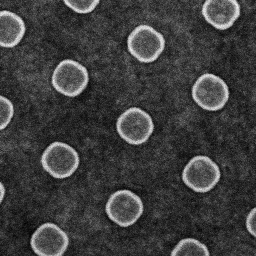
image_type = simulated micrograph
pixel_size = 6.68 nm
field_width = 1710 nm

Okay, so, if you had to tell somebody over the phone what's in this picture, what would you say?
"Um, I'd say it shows raised bodies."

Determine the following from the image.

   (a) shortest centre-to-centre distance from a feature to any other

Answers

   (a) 80.5 px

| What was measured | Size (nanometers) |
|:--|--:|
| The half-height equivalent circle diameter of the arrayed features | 224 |